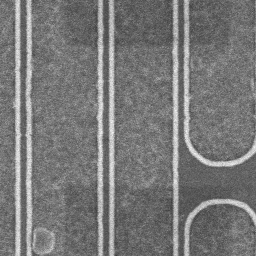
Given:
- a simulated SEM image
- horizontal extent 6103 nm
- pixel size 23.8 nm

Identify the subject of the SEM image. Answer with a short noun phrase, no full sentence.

one or a few lines or trenches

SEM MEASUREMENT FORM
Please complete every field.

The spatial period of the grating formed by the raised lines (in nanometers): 1900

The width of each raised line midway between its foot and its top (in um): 0.256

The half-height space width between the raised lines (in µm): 1.54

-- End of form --